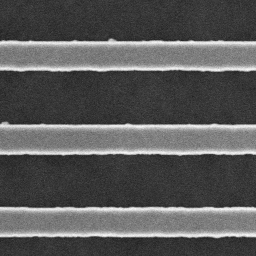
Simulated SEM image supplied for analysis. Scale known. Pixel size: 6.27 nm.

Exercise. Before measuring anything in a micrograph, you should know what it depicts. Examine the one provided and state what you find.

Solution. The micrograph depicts lines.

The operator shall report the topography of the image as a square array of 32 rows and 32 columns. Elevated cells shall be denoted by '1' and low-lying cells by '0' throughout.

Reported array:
00000000000000000000000000000000
00000000000000000000000000000000
00000000000000000000000000000000
00000000000000000000000000000000
00000000000000000000000000000000
11111111111111111111111111111111
11111111111111111111111111111111
11111111111111111111111111111111
11111111111111111111111111111111
00000000000000000000000000000000
00000000000000000000000000000000
00000000000000000000000000000000
00000000000000000000000000000000
00000000000000000000000000000000
00000000000000000000000000000000
00000000000000000000000000000000
11111111111111111111111111111111
11111111111111111111111111111111
11111111111111111111111111111111
00000000000000000000000000000000
00000000000000000000000000000000
00000000000000000000000000000000
00000000000000000000000000000000
00000000000000000000000000000000
00000000000000000000000000000000
00000000000000000000000000000000
11111111111111111111111111111111
11111111111111111111111111111111
11111111111111111111111111111111
11110110101111111111111111110111
00000000000000000000000000000000
00000000000000000000000000000000